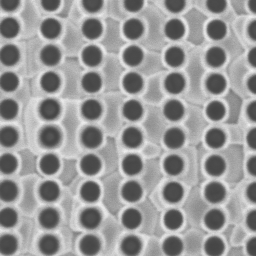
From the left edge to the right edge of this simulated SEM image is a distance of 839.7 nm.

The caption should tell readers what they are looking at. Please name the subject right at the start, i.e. a regular array of holes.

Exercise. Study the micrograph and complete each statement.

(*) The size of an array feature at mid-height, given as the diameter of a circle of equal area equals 64.5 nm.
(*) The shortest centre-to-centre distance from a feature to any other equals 0.0883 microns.